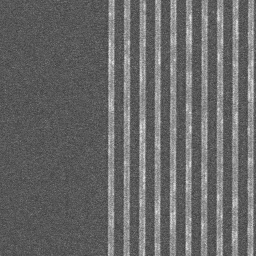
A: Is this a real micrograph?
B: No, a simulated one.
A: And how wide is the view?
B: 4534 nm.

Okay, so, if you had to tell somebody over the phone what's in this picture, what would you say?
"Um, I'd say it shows parallel lines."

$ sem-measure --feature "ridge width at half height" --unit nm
93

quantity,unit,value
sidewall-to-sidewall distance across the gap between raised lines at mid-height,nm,186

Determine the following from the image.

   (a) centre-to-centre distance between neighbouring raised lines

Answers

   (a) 274 nm